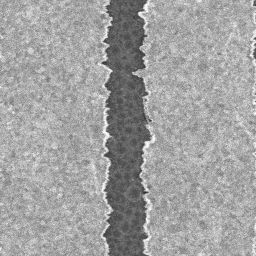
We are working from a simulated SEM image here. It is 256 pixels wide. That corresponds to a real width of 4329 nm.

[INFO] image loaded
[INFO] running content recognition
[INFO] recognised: one or a few lines or trenches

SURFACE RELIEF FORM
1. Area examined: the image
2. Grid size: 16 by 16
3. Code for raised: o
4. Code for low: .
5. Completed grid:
ooooooo..ooooooo
ooooooo..ooooooo
ooooooo..ooooooo
ooooooo..ooooooo
ooooooo..ooooooo
ooooooo..ooooooo
ooooooo..ooooooo
ooooooo..ooooooo
ooooooo..ooooooo
ooooooo..ooooooo
ooooooo..ooooooo
ooooooo..ooooooo
ooooooo..ooooooo
ooooooo..ooooooo
ooooooo..ooooooo
ooooooo..ooooooo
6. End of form